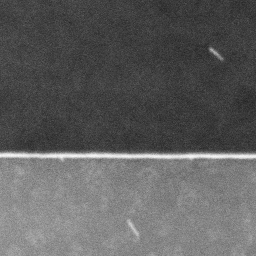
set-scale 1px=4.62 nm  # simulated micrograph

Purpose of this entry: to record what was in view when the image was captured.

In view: one or a few lines or trenches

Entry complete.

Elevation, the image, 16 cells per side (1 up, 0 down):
1111111111111111
1111111111111111
1111111111111111
1111111111111111
1111111111111111
1111111111111111
1111111111111111
1111111111111111
1111111111111111
1111111111111111
0000000000000000
0000000000000000
0000000000000000
0000000000000000
0000000000000000
0000000000000000